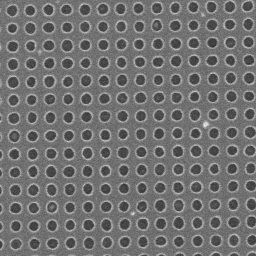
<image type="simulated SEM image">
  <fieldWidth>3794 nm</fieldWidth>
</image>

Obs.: a regular array of holes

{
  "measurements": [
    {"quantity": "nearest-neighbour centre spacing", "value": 263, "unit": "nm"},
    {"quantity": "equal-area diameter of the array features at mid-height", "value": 159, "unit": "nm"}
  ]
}